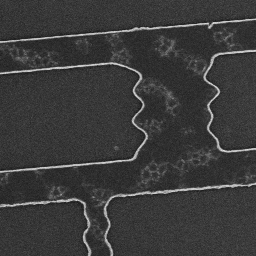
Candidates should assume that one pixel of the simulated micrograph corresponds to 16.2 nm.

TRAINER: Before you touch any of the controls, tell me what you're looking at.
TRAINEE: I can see one or a few lines or trenches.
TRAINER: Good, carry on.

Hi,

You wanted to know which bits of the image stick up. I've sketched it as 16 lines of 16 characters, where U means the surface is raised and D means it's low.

DDDDDDDDDDDDDDDD
DDDDDDDDDDDDDUUU
DUUUUUUUUUUUUUUU
UUUUUUUUUUUUUUDD
UDDDDDDDUUUUUDDD
DDDDDDDDUUUUUDDD
DDDDDDDDDUUUUDDD
DDDDDDDDUUUUUDDD
DDDDDDDDDUUUUDDD
DDDDDDDDDUUUUUUU
DDDUUUUUUUUUUUUU
UUUUUUUUUUUUUUUU
UUUUUUUDDDDDDDDD
DDDDDUUDDDDDDDDD
DDDDDUUDDDDDDDDD
DDDDDUUDDDDDDDDD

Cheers